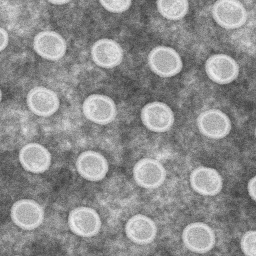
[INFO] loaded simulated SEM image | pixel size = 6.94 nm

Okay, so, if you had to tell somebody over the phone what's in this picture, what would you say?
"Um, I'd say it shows a regular array of raised bodies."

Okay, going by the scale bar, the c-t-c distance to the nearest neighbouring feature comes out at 394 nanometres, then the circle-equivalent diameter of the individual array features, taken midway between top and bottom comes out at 0.196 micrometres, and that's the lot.